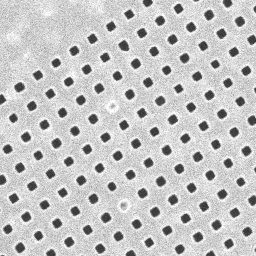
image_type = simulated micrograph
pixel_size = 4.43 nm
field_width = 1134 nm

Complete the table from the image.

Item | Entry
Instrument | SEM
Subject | a regular array of holes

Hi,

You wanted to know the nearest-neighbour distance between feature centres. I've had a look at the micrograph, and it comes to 96.6 nanometres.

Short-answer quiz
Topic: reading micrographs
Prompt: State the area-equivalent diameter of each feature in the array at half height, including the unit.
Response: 0.0438 um